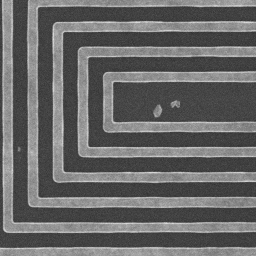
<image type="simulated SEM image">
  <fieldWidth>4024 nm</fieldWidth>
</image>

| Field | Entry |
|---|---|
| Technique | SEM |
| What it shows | groups of lines, slits or small figures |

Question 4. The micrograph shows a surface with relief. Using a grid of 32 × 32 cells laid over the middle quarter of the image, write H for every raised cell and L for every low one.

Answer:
LLLLHHLLLLLLLLLLLLLLLLLLLLLLLLLL
LLLLHHLLLLLLLLLLLLLLLLLLLLLLLLLL
LLLLHHLLLLHHHHHHHHHHHHHHHHHHHHHH
LLLLHHLLLLHHHHHHHHHHHHHHHHHHHHHH
LLLLHHLLLLHHHLLLLLLLLLLLLLLLLLLL
LLLLHHLLLLHHLLLLLLLLLLLLLLLLLLLL
LLLLHHLLLLHHLLLLLLLLLLLLLLLLLLLL
LLLLHHLLLLHHLLLLLLLLLLLLLLLLLLLL
LLLLHHLLLLHHLLLLLLLLLLLLLLLLLLLL
LLLLHHLLLLHHLLLLLLLLLLLLLLLLLLLL
LLLLHHLLLLHHLLLLLLLLLLLLLLLLLLLL
LLLLHHLLLLHHLLLLLLLLLLLLLLLLLLLL
LLLLHHLLLLHHLLLLLLLLLLLLLLLLLLLL
LLLLHHLLLLHHLLLLLLLLLLLLLLLLLLLL
LLLLHHLLLLHHHLLLLLLLLLLLLLLLLLLL
LLLLHHLLLLHHHHHHHHHHHHHHHHHHHHHH
LLLLHHLLLLHHHHHHHHHHHHHHHHHHHHHH
LLLLHHLLLLLLLLLLLLLLLLLLLLLLLLLL
LLLLHHLLLLLLLLLLLLLLLLLLLLLLLLLL
LLLLHHLLLLLLLLLLLLLLLLLLLLLLLLLL
LLLLHHLLLLLLLLLLLLLLLLLLLLLLLLLL
LLLLHHHHHHHHHHHHHHHHHHHHHHHHHHHH
LLLLHHHHHHHHHHHHHHHHHHHHHHHHHHHH
LLLLLLLLLLLLLLLLLLLLLLLLLLLLLLLL
LLLLLLLLLLLLLLLLLLLLLLLLLLLLLLLL
LLLLLLLLLLLLLLLLLLLLLLLLLLLLLLLL
LLLLLLLLLLLLLLLLLLLLLLLLLLLLLLLL
HHHHHHHHHHHHHHHHHHHHHHHHHHHHHHHH
HHHHHHHHHHHHHHHHHHHHHHHHHHHHHHHH
HLLLLLLLLLLLLLLHHHHHHHHHHHLLHHLL
LLLLLLLLLLLLLLLLLLLLLLLLLLLLLLLL
LLLLLLLLLLLLLLLLLLLLLLLLLLLLLLLL